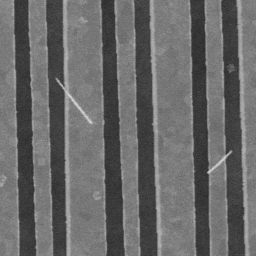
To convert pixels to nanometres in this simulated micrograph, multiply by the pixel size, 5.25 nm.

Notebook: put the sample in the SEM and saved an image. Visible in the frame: lines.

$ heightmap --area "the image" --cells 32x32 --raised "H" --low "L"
HHLLHHLLHHHHHLHHHLLHHHHHLLHHLLHH
HHLLHHLLHHHHHLHHHLLHHHHHLLHHLLHH
HHLLHHLLHHHHHLHHHLLHHHHHLLHHLLHH
HHLLHHLLHHHHHLHHHLLHHHHHLLHHLLHH
HHLLHHLLHHHHHLHHHLLHHHHHLLHHLLHH
HHLLHHLLHHHHHLLHHLLHHHHHLLHHLLHH
HHLLHHLLHHHHHLLHHLLHHHHHLLHHLLHH
HHLLHHLLHHHHHLLHHLLHHHHHLLHHLLHH
HHLLHHLLHHHHHLLHHLLHHHHHLLHHLLHH
HHLLHHLLHHHHHLLHHLLHHHHHLLHHLLHH
HHLLHHLLHHHHHLLHHLLHHHHHLLHHLLHH
HHLLHHLLHHHHHLLHHLLHHHHHLLHHLLHH
HHLLHHLLHHHHHLLHHLLHHHHHLLHHLLHH
HHLLHHLLHHHHHLLHHLLHHHHHLLHHLLHH
HHLLHHLLHHHHHLLHHLLHHHHHLLHHLLHH
HHLLHHLLHHHHHLLHHLLHHHHHLLHHLLHH
HHLLHHLLHHHHHLLHHLLHHHHHLLHHLLHH
HHLLHHLLHHHHHLLHHLLLHHHHLLHHLLHH
HHLLHHLLHHHHHLLHHLLLHHHHLLHHLLHH
HHLLHHLLHHHHHLLHHLLLHHHHLLHHLLHH
HHLLHHLLHHHHHLLHHLLLHHHHLLHHLLHH
HHLLHHLLHHHHHLLHHLLLHHHHLLHHLLLH
HHLLHHLLHHHHHLLHHLLLHHHHLLHHLLLH
HHLLHHLLHHHHHLLHHLLLHHHHLLHHLLLH
HHLLHHLLHHHHHLLHHLLLHHHHLLHHLLLH
HHLLHHLLHHHHHLLHHLLLHHHHLLHHLLLH
HHLLHHLLHHHHHLLHHLLLHHHHLLHHLLLH
HHLLHHLLLHHHHLLHHLLLHHHHLLHHLLLH
HHLLLHLLLHHHHLLHHLLLHHHHLLHHLLLH
HHLLLHHLLHHHHLLLHLLLHHHHLLHHLLLH
HHLLLHHLLHHHHLLLHLLLHHHHLLHHLLLH
HHLLLHHLLHHHHLLLHLLLHHHHLLHHLLLH